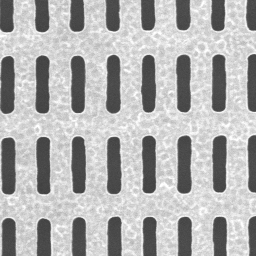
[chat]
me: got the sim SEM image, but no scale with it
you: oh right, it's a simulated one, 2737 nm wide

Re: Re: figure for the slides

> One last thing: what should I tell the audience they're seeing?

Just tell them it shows a regular array of holes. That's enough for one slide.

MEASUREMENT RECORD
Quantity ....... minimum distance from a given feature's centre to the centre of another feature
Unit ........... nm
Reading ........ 375